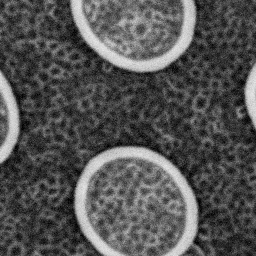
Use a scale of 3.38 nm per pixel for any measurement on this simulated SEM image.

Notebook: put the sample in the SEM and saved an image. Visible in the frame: raised bodies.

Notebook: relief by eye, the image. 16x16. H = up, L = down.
LLLLLHHHHHHHLLLL
LLLLLHHHHHHHLLLL
LLLLLLHHHHHHLLLL
LLLLLLLHHHHLLLLL
LLLLLLLLLLLLLLLL
LLLLLLLLLLLLLLLL
HLLLLLLLLLLLLLLL
HLLLLLLLLLLLLLLL
HLLLLLLLLLLLLLLL
LLLLLLLLHLLLLLLL
LLLLLLHHHHHLLLLL
LLLLLHHHHHHLLLLL
LLLLLHHHHHHHLLLL
LLLLLHHHHHHHLLLL
LLLLLLHHHHHHLLLL
LLLLLLHHHHHLLLLL